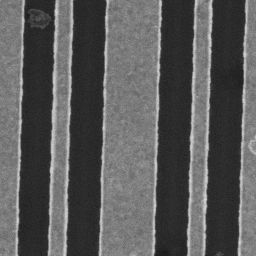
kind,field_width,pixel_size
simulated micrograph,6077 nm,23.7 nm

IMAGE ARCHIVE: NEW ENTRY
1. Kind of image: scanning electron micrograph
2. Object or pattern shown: lines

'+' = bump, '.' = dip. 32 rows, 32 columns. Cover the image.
+++....++....+++++++....++.....+
+++....++....+++++++....++.....+
+++....++....+++++++....++.....+
+++....++....+++++++....++.....+
+++....++....+++++++....++.....+
+++....++....+++++++....++.....+
+++....++....+++++++....++.....+
+++....++....+++++++....++.....+
+++....++....+++++++....++.....+
+++....++....+++++++....++.....+
+++....++....+++++++....++.....+
+++....++....+++++++....++....++
+++....++....+++++++....++....++
+++....++....+++++++....++....++
+++....++....+++++++....++....++
+++....++....+++++++....++....++
++.....++....+++++++....++....++
++.....++....+++++++....++....++
++.....++....+++++++....++....++
++.....+.....+++++++....++....++
++.....+.....+++++++....++....++
++.....+.....+++++++....++....++
++....++.....++++++.....++....++
++....++.....++++++.....++....++
++....++.....++++++.....++....++
++....++.....++++++.....++....++
++....++.....++++++.....++....++
++....++.....++++++.....++....++
++....++.....++++++.....++....++
++....++.....++++++.....+.....++
++....++....+++++++.....+.....++
++....++....+++++++.....+.....++